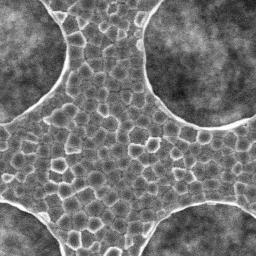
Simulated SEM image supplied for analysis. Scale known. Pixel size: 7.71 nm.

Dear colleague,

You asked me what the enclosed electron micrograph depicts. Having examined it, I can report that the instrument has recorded holes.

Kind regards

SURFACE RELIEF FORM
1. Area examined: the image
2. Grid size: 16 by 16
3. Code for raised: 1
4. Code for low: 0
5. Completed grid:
0001111111000000
0000111110000000
0000111110000000
0000111110000000
0000111110000000
0001111110000000
0011111111000000
0111111111100001
1111111111111111
1111111111111111
1111111111111111
1111111111111111
1111111111111111
0011111111100000
0001111111000000
0000111110000000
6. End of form